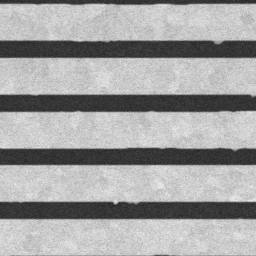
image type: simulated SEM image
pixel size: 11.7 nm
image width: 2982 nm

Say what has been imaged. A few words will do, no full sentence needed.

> lines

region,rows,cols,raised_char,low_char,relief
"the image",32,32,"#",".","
................................
################################
################################
################################
################################
................................
................................
################################
################################
################################
################################
################################
................................
................................
################################
################################
################################
################################
................................
................................
................................
################################
################################
################################
################################
................................
................................
################################
################################
################################
################################
################################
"